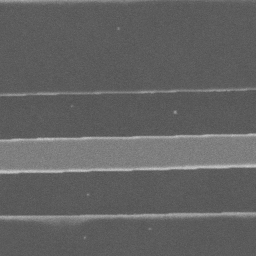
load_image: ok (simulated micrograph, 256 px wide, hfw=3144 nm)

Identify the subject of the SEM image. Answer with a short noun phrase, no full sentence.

lines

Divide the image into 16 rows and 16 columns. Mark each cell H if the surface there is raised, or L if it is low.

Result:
HHHHHHHHHHHHHHHH
HHHHHHHHHHHHHHHH
HHHHHHHHHHHHHHHH
HHHHHHHHHHHHHHHH
HHHHHHHHHHHHHHHH
HHHHHHHHHHHHHHHH
LLLLLLLLLLLLLLLL
LLLLLLLLLLLLLLLL
LLLLLLLLLLLHHHHH
HHHHHHHHHHHHHHHH
HHHHHHHHHHHHLLLL
LLLLLLLLLLLLLLLL
LLLLLLLLLLLLLLLL
LLLLLLHHHHHHHHHH
HHHHHHHHHHHHHHHH
HHHHHHHHHHHHHHHH